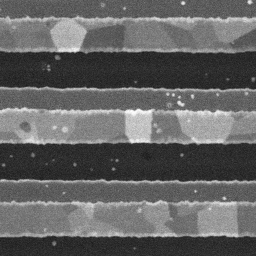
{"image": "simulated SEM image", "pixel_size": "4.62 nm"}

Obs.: lines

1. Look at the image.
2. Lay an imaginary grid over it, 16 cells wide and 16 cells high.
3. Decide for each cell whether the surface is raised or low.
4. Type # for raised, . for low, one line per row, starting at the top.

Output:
################
################
################
................
................
###.............
################
################
################
................
................
################
################
################
################
................